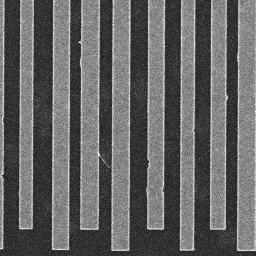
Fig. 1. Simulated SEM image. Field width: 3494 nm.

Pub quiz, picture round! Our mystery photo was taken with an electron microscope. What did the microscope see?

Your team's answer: parallel lines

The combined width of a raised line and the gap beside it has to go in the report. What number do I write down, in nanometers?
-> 437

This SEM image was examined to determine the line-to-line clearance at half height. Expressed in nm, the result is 227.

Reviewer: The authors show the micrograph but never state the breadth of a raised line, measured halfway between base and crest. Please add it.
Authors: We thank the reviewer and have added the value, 220 nm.